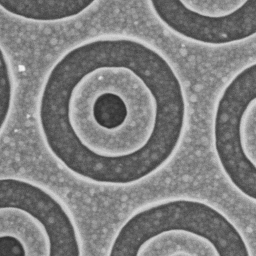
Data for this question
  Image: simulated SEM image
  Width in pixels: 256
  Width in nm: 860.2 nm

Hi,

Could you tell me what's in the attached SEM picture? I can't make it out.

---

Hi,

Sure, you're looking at ring-shaped grooves with a dot in the middle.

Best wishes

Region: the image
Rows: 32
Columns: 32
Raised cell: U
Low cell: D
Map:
DDDDDDDDDDDUUUUUUUUDDDDUUUUUUUDD
UDDDDDDDDDUUUUUUUUUDDDDDUUUUUDDD
UUUUUDUUUUUUUUUUUUUUDDDDDDDDDDDD
UUUUUUUUUUUUUUUUUUUUUDDDDDDDDDDD
UUUUUUUUUUUUUUUUUUUUUUUDDDDDDDDU
UUUUUUUUUUUDDDDDDDUUUUUUUUUUUUUU
UUUUUUUUUDDDDDDDDDDDUUUUUUUUUUUU
DUUUUUUUDDDDDDDDDDDDDUUUUUUUUUUU
DUUUUUUDDDDDDUUUDDDDDUUUUUUUUUUD
DUUUUUDDDDDUUUUUUDDDDDUUUUUUUUDD
DDUUUUDDDDUUUUUUUUDDDDUUUUUUUDDD
DDUUUDDDDUUUUUUUUUUDDDDUUUUUDDDD
DUUUUDDDDUUUDDDUUUUDDDDUUUUDDDDD
DUUUUDDDDUUUDDDDUUUDDDDUUUUDDDDU
DUUUUDDDDUUUDDDDUUUDDDDUUUUDDDDU
UUUUUDDDDUUUDDDUUUUDDDDUUUUDDDUU
UUUUUDDDDUUUUUUUUUUDDDDUUUUDDDUU
UUUUUUDDDDUUUUUUUUDDDDUUUUUDDDUU
UUUUUUDDDDDUUUUUUDDDDDUUUUUDDDUU
UUUUUUUDDDDDDDDDDDDDDUUUUUUDDDDU
UUUUUUUUDDDDDDDDDDDDUUUUUUUUDDDD
UUUUUUUUUDDDDDDDDDDUUUUUUUUUDDDD
DDUUUUUUUUUDDDDDDUUUUUUUUUUUUDDD
DDDDDUUUUUUUUUUUUUUUUUUUUUUUUUDD
DDDDDDDUUUUUUUUUUUUUUUUUUUUUUUUD
DDDDDDDDUUUUUUUUUUUUDDDDDDUUUUUU
UUUDDDDDUUUUUUUUUDDDDDDDDDDUUUUU
UUUUDDDDDUUUUUUUDDDDDDDDDDDDUUUU
UUUUUDDDDUUUUUUDDDDDDDDDDDDDDUUU
UUUUUUDDDDUUUUUDDDDUUUUUUDDDDDUU
DDDUUUDDDDUUUUDDDDUUUUUUUUDDDDDU
DDDUUUDDDDUUUUDDDUUUUUUUUUUDDDDU